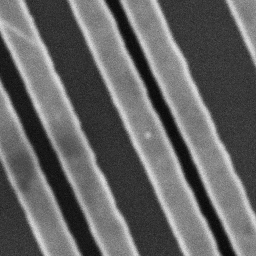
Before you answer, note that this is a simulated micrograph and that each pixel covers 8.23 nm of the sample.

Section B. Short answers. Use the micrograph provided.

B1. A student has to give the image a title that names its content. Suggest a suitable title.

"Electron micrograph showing lines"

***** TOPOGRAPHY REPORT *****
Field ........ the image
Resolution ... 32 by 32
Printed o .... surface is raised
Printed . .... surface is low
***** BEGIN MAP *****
ooo......oooo..ooooo.........ooo
ooo......ooooo..oooo.........ooo
oooo......oooo..ooooo.........oo
oooo......ooooo..oooo.........oo
ooooo......oooo..oooo.........oo
.oooo......oooo...oooo.........o
.ooooo.....ooooo..ooooo........o
..oooo......oooo..ooooo.........
..ooooo.....ooooo..oooo.........
...oooo......oooo..ooooo........
...ooooo.....ooooo..oooo........
o...oooo......oooo..ooooo.......
o...ooooo.....ooooo..oooo.......
oo..ooooo......oooo..ooooo......
oo...ooooo.....ooooo..oooo......
ooo..ooooo......oooo..ooooo.....
ooo...oooo......ooooo..oooo.....
ooo...ooooo.....ooooo..oooo.....
oooo...oooo......ooooo..oooo....
oooo...ooooo......oooo..ooooo...
ooooo...oooo......oooo..ooooo...
.oooo...ooooo.....ooooo..oooo...
.ooooo...oooo......oooo..ooooo..
..oooo...ooooo.....ooooo..oooo..
..ooooo...oooo......oooo..ooooo.
...oooo...oooo......ooooo..oooo.
...ooooo...oooo......oooo..ooooo
....oooo...oooo......ooooo..oooo
....oooo...ooooo......oooo..oooo
....ooooo...oooo......ooooo..ooo
.....oooo...ooooo.....ooooo..ooo
.....ooooo...oooo......oooo..ooo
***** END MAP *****